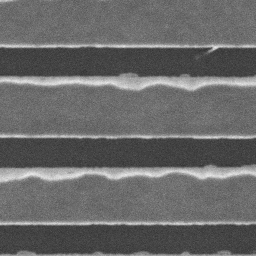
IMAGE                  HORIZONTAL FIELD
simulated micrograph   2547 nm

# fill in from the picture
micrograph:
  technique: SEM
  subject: lines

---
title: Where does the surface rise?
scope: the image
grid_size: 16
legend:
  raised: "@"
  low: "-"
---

@@@@@@@@@@@@@@@@
@@@@@@@@@@@@@@@@
@@@@@@@@@@@@@@@@
----------------
----------------
@@@@@@@@@@@@@@@@
@@@@@@@@@@@@@@@@
@@@@@@@@@@@@@@@@
@@@@@@@@@@@@@@@@
----------------
----------------
@@@@@@@@@@@@@@@@
@@@@@@@@@@@@@@@@
@@@@@@@@@@@@@@@@
----------------
----------------